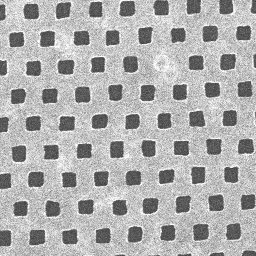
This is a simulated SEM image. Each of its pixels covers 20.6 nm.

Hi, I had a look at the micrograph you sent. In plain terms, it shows a regular array of holes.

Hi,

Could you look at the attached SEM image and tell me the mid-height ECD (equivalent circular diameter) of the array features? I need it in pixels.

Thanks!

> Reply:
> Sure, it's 16.5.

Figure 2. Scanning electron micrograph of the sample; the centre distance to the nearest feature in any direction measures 653 nanometres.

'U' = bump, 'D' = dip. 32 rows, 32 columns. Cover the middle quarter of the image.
DDUUUUUDDDUUUUUDDDDUUUUUUUUUUUUD
DDUUUUUDDDUUUUUDDDUUUUUUUUUUUUUU
DDUUUUUUUUUUUUUUUUUUUUUUUUUUUUUU
UUUUUUUUUUUUUUUUUUUUUUUUUUUUUUUU
UUUUUUUUUUUUUUUUUUUUUUUUUUUUUUUU
UUUUUUUUUUUDDDDUUUUDDDDUUUUDDDDU
UUUDDDDUUUUDDDDUUUUDDDDUUUUDDDDU
UUUDDDDUUUUDDDDUUUUDDDDUUUUDDDDU
UUUDDDDUUUUDDDDUUUUDDDUUUUUDDDDU
UUUDDDUUUUUUUUUUUUUUUUUUUUUUUUUU
UUUUUUUUUUUUUUUUUUUUUUUUUUUUUUUU
UUUUUUUUUUUUUUUUUUUUUUUUUUUUUUUU
UUUUUUUUDDUUUUUUUDUUUUUUDDUUUUUD
DDDUUUUDDDDUUUUDDDDUUUUDDDDUUUUD
DDDUUUUDDDDUUUUDDDDUUUUDDDDUUUUD
DDDUUUUDDDDUUUUDDDDUUUUDDDDUUUUU
DDUUUUUUUUUUUUUUUUUUUUUUUUUUUUUU
UUUUUUUUUUUUUUUUUUUUUUUUUUUUUUUU
UUUUUUUUUUUUUUUUUUUUUUUUUUUUUUUU
UUUUUUUUUUUUDDDUUUUUDDDUUUUUDDDU
UUUDDDDUUUUDDDDUUUUDDDDUUUUDDDDU
UUUDDDDUUUUDDDDUUUUDDDDUUUUDDDDU
UUUDDDDUUUUDDDDUUUUUDDDUUUUUDDDU
UUUDDDDUUUUUDDUUUUUUUUUUUUUUUUUU
UUUUUUUUUUUUUUUUUUUUUUUUUUUUUUUU
UUUUUUUUUUUUUUUUUUUUUUUUUUUUUUUU
UUUUUUUUUUUUUUUUUDUUUUUUUDDDUUUU
DDDUUUUDDDDUUUUDDDDUUUUUDDDDUUUU
DDDUUUUDDDDUUUUDDDDUUUUUDDDUUUUU
DDDUUUUUDDDUUUUUDDDUUUUUDDDUUUUU
DDDUUUUUDDUUUUUUUUUUUUUUUUUUUUUU
UUUUUUUUUUUUUUUUUUUUUUUUUUUUUUUU